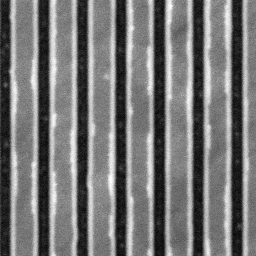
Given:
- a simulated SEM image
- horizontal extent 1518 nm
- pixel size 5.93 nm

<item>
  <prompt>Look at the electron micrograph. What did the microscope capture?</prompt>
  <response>parallel lines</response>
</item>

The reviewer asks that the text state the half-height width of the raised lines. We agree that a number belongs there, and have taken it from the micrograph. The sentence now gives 139 nm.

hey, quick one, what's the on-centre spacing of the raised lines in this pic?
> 38.7 px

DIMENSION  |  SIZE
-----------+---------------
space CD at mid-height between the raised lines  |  87.5 nanometers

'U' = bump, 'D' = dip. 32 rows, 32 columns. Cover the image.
DDUUDDUUUDDUUUDDUUUDDUUUDDUUUDDU
DDUUDDUUUDDUUUDDUUUDDUUUDDUUUDDU
DDUUDDUUUDDUUUDDUUUDDUUUDDUUUDDU
DDUUDDUUUDDUUUDDUUUDDUUUDDUUUDDU
DDUUDDUUUDDUUUDDUUUDDUUUDDUUUDDU
DDUUDDUUUDDUUUDDUUUDDUUUDDUUUDDU
DDUUDDUUUDDUUUDDUUUDDUUUDDUUUDDU
DDUUDDUUUDDUUUDDUUUDDUUUDDUUUDDU
DDUUDDUUUDDUUUDDUUUDDUUUDDUUUDDU
DUUUDDUUUDDUUUDDUUUDDUUUDDUUUDDU
DDUUDDUUUDDUUUDDUUUDDUUUDDUUUDDU
DDUUDDUUUDDUUUDDUUUDDUUUDDUUUDDU
DDUUDDUUUDDUUUDDUUUDDUUUDDUUUDDU
DDUUDDDUUDDUUUDDUUUDDUUUDDUUUDDU
DDUUDDUUUDDUUUDDUUUDDUUUDDUUUDDU
DDUUDDUUUDDUUUDDUUUDDUUUDDUUUDDU
DDUUDDUUUDDUUUDDUUUDDUUUDDUUUDDU
DDUUDDUUUDDUUUDDUUUDDUUUDDUUUDDU
DDUUDDUUUDDUUUDDUUUDDUUUDDUUUDDU
DDUUDDUUUDDUUUDDUUUDDUUUDDUUUDDU
DDUUDDUUUDDUUUDDUUUDDUUUDDUUUDDU
DDUUDDUUUDDUUUDDUUUDDUUUDDUUUDDU
DDUUDDUUUDDUUUDDUUUDDUUUDDUUUDDU
DDUUDDUUUDDUUUDDUUUDDUUUDDUUUDDU
DDUUDDUUUDDUUUDDUUUDDUUUDDUUUDDU
DDUUDDUUUDDUUUDDUUUDDUUUDDUUUDDU
DDUUDDUUUDDUUUDDUUUDDUUUDDUUUDDU
DDUUDDUUUDDUUUDDUUUDDUUUDDUUUDDU
DDUUDDUUUUDUUUDDUUUDDUUUDDUUUDDU
DDUUDDUUUUDUUUDDUUUDDUUUDDUUUDDU
DDUUDDUUUDDUUUDDUUUDDUUUDDUUUDDU
DDUUDDUUUDDUUUDDUUUDDUUUDDUUUDDU